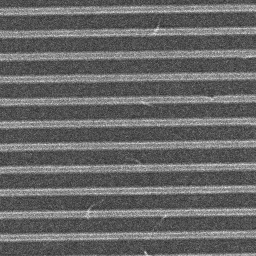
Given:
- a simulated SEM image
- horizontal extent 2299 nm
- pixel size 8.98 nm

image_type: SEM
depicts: parallel lines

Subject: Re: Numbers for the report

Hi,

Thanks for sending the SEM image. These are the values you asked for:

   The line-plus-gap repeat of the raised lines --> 203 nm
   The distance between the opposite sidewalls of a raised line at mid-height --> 57.3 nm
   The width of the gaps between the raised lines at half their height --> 146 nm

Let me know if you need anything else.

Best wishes